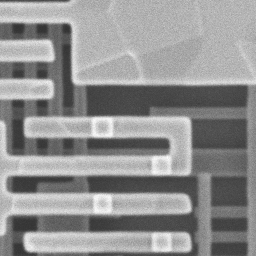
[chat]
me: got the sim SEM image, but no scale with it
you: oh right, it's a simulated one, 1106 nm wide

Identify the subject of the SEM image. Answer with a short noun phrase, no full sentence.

wiring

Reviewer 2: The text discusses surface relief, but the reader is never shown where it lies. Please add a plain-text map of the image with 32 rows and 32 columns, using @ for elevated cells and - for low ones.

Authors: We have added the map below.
@@@@@@@@@@@@@@@@@@@@@@@@@@@@@@@@
@@@@@@@@@@@@@@@@@@@@@@@@@@@@@@@@
@@@@@@@@@@@@@@@@@@@@@@@@@@@@@@@@
---------@@@@@@@@@@@@@@@@@@@@@@@
---------@@@@@@@@@@@@@@@@@@@@@@@
@@@@@@@--@@@@@@@@@@@@@@@@@@@@@@@
@@@@@@@--@@@@@@@@@@@@@@@@@@@@@@@
@@@@@@@--@@@@@@@@@@@@@@@@@@@@@@@
---------@@@@@@@@@@@@@@@@@@@@@@@
---------@@@@@@@@@@@@@@@@@@@@@@@
@@@@@@@--@@@@@@@@@@@@@@@@@@@@@@@
@@@@@@@-------------------------
--------------------------------
--------------------------------
--------------------------------
@--@@@@@@@@@@@@@@@@@@@@@--------
@--@@@@@@@@@@@@@@@@@@@@@--------
@--------------------@@@--------
@--------------------@@@--------
@@------------------@@@@--------
@@@@@@@@@@@@@@@@@@@@@@@@--------
@@@@@@@@@@@@@@@@@@@@@@@@--------
@-------------------------------
@-------------------------------
@@@@@@@@@@@@@@@@@@@@@@@---------
@@@@@@@@@@@@@@@@@@@@@@@@--------
@@@@@@@@@@@@@@@@@@@@@@@@--------
@-------------------------------
@-------------------------------
---@@@@@@@@@@@@@@@@@@@@@--------
---@@@@@@@@@@@@@@@@@@@@@--------
--------------------------------